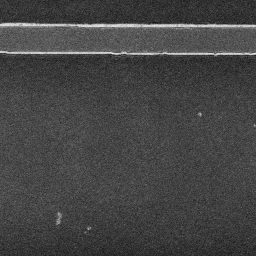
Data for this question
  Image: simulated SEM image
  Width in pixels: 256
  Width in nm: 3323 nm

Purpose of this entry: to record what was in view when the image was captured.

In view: lines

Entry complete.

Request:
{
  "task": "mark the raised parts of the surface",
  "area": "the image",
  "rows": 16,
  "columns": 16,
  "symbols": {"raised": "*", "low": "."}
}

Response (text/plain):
****************
****************
****************
................
................
................
................
................
................
................
................
................
................
................
................
................